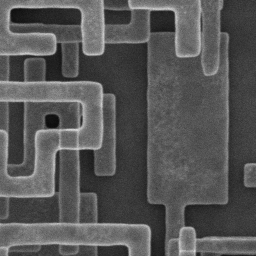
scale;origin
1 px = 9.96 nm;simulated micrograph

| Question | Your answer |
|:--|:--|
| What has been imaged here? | wiring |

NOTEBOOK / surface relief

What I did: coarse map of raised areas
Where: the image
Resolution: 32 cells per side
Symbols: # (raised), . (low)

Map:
#############...###########.....
#.........###...###...#####.....
#.........###...###...#####.....
###################...#####.....
###################...#####.....
#######...####........#####.....
#######....##.........#####.....
#........................##.....
#........................##.....
#...............................
############....................
#############...................
#############...................
#..##########...................
#..###.######...................
#..##...#####...................
#..##########...................
#..##########...................
#..#########....................
#..####.##......................
#..####.##......................
#######.##......................
##########......................
##########......................
######.###......................
#......###......................
#......###......................
.......###......................
###################....#........
###################...###.......
######.############..###########
#.......##......###..####.######